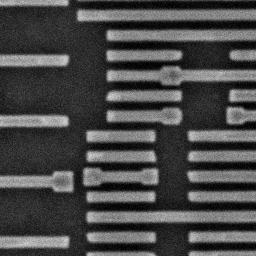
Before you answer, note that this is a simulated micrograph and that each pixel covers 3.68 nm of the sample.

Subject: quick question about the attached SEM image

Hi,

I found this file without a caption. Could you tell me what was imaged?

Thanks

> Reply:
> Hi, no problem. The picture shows wiring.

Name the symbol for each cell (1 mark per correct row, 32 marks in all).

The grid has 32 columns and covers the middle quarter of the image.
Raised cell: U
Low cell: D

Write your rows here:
DDDDDDDDDDDDDDDDDDDDDDDDDDDDDDDD
DDDDDDDDDDDDDDDDDDDDDDDDUUUUUDDD
DDDDDDDDDDDUUUUUUUUUUUUUUUUUUUUU
DDDDDDDDDDDUUUUUUUUUUUUUUUUUUUUU
DDDDDDDDDDDDDDDDDDDDDDDDUUUUUDDD
DDDDDDDDDDDDDDDDDDDDDDDDDDDDDDDD
DDDDDDDDDDDDDDDDDDDDDDDDDDDDDDDD
DDDDDDDDDDDUUUUUUUUUUUUUUUUUUDDD
DDDDDDDDDDDUUUUUUUUUUUUUUUUUUDDD
DDDDDDDDDDDDDDDDDDDDDDDDDDDDDDDD
DDDDDDDDDDDDDDDDDDDDDDDDDDDDDDDD
DDDDDDDDDDDDDDDDDDDDDDDDDUUUUDDD
DDDDDDDDDDDUUUUUUUUUUUUUUUUUUDDD
UDDDDDDDDDDUUUUUUUUUUUUUUUUUUDDD
UDDDDDDDDDDDDDDDDDDDDDDDUUUUUDDD
DDDDDDDDDDDDDDDDDDDDDDDDDDDDDDDD
DDDDDDDDDDDDDDDDDDDDDDDDDDDDDDDD
DDDDDDUUUUUUUUUUUUUUUUUDDDDDDDDU
DDDDDDUUUUUUUUUUUUUUUUUDDDDDDDDU
DDDDDDDDDDDDDDDDDDDDDDDDDDDDDDDD
DDDDDDDDDDDDDDDDDDDDDDDDDDDDDDDD
DDDDDDDDDDDDDDDDDDDDDDDDDDDDDDDD
DDDDDDUUUUUUUUUUUUUUUUUDDDDDDDDU
DDDDDDUUUUUUUUUUUUUUUUUDDDDDDDDU
DDDDDDDDDDDDDDDDDDDDDDDDDDDDDDDD
DDDDDDDDDDDDDDDDDDDDDDDDDDDDDDDD
DDDDDUUUUDDDDDDDDDDDUUUDDDDDDDDD
UUDDDUUUUUUUUUUUUUUUUUUDDDDDDDDU
UUDDDUUUUUUUUUUUUUUUUUUDDDDDDDDU
UUDDDUUUUUDDDDDDDDDUUUUDDDDDDDDD
UUDDDDDDDDDDDDDDDDDDDDDDDDDDDDDD
UUDDDDDDDDDDDDDDDDDDDDDDDDDDDDDD